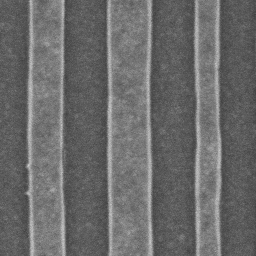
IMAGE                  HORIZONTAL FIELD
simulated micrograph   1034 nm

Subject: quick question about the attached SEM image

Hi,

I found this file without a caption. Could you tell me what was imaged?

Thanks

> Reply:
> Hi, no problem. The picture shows one or a few lines or trenches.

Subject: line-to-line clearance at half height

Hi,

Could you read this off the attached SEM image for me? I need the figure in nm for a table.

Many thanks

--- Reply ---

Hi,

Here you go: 192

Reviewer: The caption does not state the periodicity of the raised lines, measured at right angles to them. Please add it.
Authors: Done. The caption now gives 80.6 px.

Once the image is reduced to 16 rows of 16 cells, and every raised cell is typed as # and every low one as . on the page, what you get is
..##...##...##..
..##...##...##..
..##...##...##..
..##...##...##..
..##...##...##..
..##...##...##..
..##...##...##..
..##...##...##..
..##...##...##..
..##...##...##..
..##...##...##..
..##...##...##..
..##...##...##..
..##...##...##..
..##...##...##..
..##...##...##..